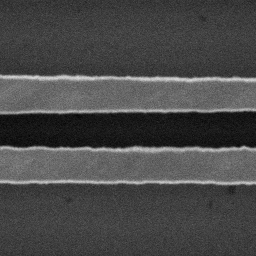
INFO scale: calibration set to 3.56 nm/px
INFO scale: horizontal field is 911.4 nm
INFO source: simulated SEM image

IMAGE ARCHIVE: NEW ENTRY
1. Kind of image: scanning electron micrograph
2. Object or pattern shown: lines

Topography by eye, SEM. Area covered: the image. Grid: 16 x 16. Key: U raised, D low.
DDDDDDDDDDDDDDDD
DDDDDDDDDDDDDDDD
DDDDDDDDDDDDDDDD
DDDDDDDDDDDDDDDD
DDDDDDDDDDDDDDDD
UUUUUUUUUUUUUUUU
UUUUUUUUUUUUUUUU
DDDDDDDDDDDDDDDD
DDDDDDDDDDDDDDDD
UUUUUUUUUUUUUUUU
UUUUUUUUUUUUUUUU
DDDDDDDDDDDDDDUU
DDDDDDDDDDDDDDDD
DDDDDDDDDDDDDDDD
DDDDDDDDDDDDDDDD
DDDDDDDDDDDDDDDD